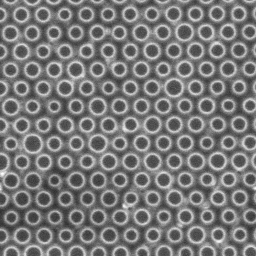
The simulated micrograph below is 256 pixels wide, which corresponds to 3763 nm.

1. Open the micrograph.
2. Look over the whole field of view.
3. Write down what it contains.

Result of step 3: a regular array of holes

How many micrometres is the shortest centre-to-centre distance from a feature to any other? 0.312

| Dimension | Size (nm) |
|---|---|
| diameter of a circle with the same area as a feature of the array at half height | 180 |